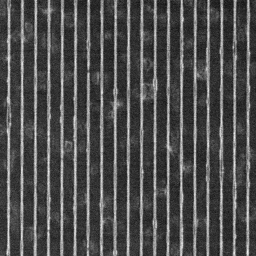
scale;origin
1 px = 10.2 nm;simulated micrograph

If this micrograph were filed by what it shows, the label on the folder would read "parallel lines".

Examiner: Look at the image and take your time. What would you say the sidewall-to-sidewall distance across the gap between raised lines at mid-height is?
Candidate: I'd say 0.116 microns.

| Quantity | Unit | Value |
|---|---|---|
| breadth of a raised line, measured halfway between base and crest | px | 1.5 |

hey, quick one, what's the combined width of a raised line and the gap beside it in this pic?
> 135 nm